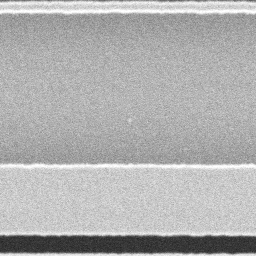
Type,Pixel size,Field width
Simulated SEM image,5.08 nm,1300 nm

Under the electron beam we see lines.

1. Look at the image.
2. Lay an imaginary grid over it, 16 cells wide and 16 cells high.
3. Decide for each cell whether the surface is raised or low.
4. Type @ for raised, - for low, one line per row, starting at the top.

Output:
@@@@@@@@@@@@@@@@
----------------
----------------
----------------
----------------
----------------
----------------
----------------
----------------
----------------
@@@@@@@@@@@@@@@@
@@@@@@@@@@@@@@@@
@@@@@@@@@@@@@@@@
@@@@@@@@@@@@@@@@
@@@@@@@@@@@@@@@@
----------------